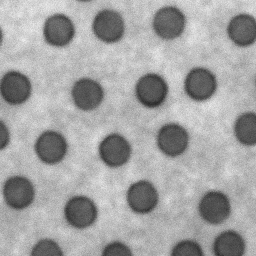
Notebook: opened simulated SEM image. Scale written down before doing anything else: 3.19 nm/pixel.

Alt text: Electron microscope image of a regular array of ring-shaped grooves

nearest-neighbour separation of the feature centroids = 172 nm